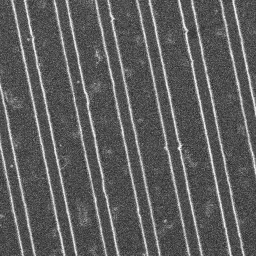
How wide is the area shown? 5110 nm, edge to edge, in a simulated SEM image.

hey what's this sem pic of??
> parallel lines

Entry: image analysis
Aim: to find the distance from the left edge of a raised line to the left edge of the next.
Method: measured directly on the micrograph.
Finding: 816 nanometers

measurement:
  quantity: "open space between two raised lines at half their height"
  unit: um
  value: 0.58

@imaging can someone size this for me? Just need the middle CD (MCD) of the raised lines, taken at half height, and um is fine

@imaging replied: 0.237